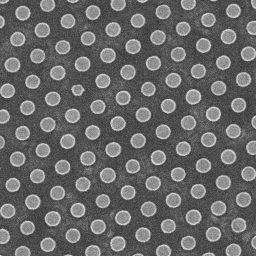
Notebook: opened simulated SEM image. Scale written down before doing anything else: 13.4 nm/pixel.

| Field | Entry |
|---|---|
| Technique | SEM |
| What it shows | a regular array of raised bodies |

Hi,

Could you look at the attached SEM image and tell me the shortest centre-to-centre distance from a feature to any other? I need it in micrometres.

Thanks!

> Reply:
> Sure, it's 0.349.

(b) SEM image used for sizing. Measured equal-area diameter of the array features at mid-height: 13.8 px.